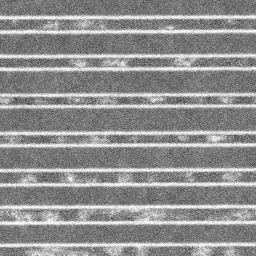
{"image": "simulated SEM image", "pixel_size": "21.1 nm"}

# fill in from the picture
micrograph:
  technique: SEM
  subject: parallel lines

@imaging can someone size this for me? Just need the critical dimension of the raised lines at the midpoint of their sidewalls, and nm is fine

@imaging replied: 516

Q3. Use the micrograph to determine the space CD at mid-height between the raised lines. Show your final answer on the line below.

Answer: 295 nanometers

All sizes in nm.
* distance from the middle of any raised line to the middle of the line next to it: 800